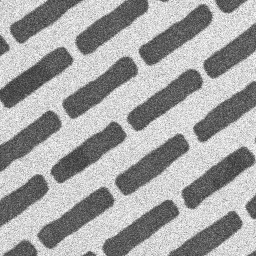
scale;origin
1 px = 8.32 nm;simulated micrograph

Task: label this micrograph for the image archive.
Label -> holes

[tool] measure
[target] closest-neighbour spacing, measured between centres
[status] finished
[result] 541 nm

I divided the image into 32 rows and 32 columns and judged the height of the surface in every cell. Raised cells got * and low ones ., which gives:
*****.....*****....********...**
****....******....******..**.***
**.....*****.....******...******
*.....*****.....*****.....*****.
**..******....******....******..
.********....*****.....*****....
.*****...*..*****.....*****.....
*****....******..*..******....**
****....******...*********...***
**.....*****.....*****...*..****
*.....*****....******....******.
....*****.....******....******..
...*****.....*****.....*****....
********...******....******.....
*****..**.******....******....**
****....******.*...******....***
**.....*****....********...*****
*.....*****.....*****..**.******
....*****.....******....******.*
...*****.....*****.....*****....
.******.....*****....******.....
******....*****.....******....**
****..*.******.....*****.....***
**....*********..******.....****
*.....*****...*********...******
....******....******..*..******.
...*****.....*****....*********.
.******....******.....*****...**
*****.....******....******....**
*****...******.....*****.....***
**..*..******....******.....****
*....********...*****.....******